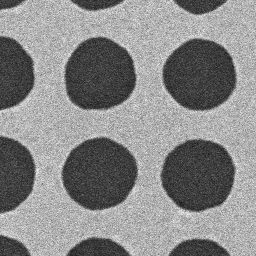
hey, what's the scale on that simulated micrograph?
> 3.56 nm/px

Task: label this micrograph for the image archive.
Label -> holes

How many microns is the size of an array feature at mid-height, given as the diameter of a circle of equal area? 0.261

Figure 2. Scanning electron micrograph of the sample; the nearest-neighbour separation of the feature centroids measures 99.1 pixels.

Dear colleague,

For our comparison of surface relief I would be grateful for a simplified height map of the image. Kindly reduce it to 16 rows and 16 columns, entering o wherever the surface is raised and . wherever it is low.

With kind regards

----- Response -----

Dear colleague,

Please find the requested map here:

.oooo..oooo...oo
oooooooooooooooo
.oooo..ooooo.ooo
..oo....ooo...oo
..oo....oo.....o
..oo....oo.....o
.oooo..oooo...oo
oooooooooooooooo
oooooooooooooooo
..oo....ooo...oo
..oo.....o.....o
..oo....oo.....o
..ooo...ooo...oo
oooooooooooooooo
oooooooooooooooo
..ooo...ooo...oo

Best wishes